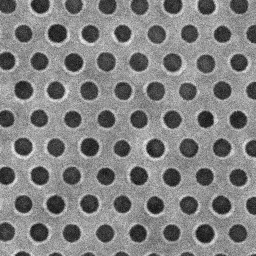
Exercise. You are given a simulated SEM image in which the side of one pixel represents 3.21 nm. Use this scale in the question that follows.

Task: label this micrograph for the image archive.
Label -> a regular array of holes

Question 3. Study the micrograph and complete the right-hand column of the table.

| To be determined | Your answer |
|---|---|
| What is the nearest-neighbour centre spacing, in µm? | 0.104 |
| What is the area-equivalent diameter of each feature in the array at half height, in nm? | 62.9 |